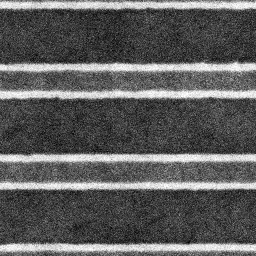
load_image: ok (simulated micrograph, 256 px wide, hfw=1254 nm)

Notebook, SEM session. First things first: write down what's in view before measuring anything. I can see one or a few lines or trenches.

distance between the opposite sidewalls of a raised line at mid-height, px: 28.3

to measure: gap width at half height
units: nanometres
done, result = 300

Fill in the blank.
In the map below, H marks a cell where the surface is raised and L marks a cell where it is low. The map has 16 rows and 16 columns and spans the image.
LLLLLLLLLLLLLLLL
LLLLLLLLLLLLLLLL
LLLLLLLLLLLLLLLL
LLLLLLLLLLLLLLLL
HHHHHHHHHHHHHHHH
HHHHHHHHHHHHHHHH
LLLLLLLLLLLLLLLL
LLLLLLLLLLLLLLLL
LLLLLLLLLLLLLLLL
LLLLLLLLLLLLLLLL
HHHHHHHHHHHHHHHH
HHHHHHHHHHHHHHHH
LLLLLLLLLLLLLLLL
LLLLLLLLLLLLLLLL
LLLLLLLLLLLLLLLL
HHHHHHHHHHHHHHHH